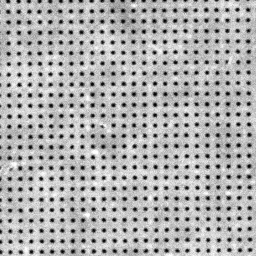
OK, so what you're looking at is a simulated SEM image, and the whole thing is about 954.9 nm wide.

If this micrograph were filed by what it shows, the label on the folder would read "a regular array of holes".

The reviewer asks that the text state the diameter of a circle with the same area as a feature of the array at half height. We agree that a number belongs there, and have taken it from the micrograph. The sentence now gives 0.0168 um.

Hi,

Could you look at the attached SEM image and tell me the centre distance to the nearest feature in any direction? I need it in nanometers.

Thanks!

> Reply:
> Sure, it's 37.9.